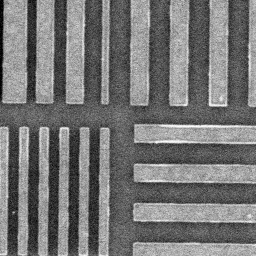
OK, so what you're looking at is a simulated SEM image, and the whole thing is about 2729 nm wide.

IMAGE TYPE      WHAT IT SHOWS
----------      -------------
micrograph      groups of lines, slits or small figures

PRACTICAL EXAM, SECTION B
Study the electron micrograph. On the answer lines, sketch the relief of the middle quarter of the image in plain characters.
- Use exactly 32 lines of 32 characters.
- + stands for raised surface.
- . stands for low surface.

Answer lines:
.++++.....+......++++......++++.
.++++.....+......++++......++++.
.++++.....+......++++......++++.
.++++.....+......++++......++++.
.++++.....+......++++......++++.
.++++.....+......++++......++++.
.++++.....+......++++......++++.
.++++.....+......++++......++++.
.++++....++......++++......++++.
.++++....++......++++......++++.
................................
................................
................................
................................
................................
..................++++++++++....
+...++...++.......++++++++++++++
+...++...++.......++++++++++++++
+...++...++.......++++++++++++++
+...++...++.....................
+...++...++.....................
+...++...++.....................
+...++...++.....................
+...++...++.....................
+...++...++.....................
+...++...++.......++++++++++++++
+...++...++.......++++++++++++++
+...++...++.......++++++++++++++
+...++...++.......++++++++++++++
+...++...++.....................
+...++...++.....................
+...++...++.....................